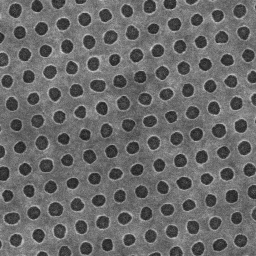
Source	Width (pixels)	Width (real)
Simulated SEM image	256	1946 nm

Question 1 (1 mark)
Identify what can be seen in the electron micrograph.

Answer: a regular array of holes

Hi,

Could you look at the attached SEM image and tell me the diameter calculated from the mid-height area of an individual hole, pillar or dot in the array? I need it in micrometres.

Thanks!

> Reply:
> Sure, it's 0.0992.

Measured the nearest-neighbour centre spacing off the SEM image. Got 165 nm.